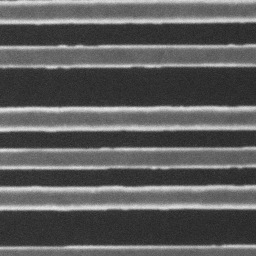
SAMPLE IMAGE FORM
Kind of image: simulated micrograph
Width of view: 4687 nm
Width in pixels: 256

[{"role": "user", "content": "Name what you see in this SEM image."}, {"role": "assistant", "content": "lines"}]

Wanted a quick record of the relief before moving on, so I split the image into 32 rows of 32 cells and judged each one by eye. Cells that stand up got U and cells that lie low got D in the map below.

UUUUUUUUUUUUUUUUUUUUUUUUUUUUUUUU
UUUUUUUUUUUUUUUUUUUUUUUUUUUUUUUU
UUUUUUUUUUUUUUUUUUUUUUUUUUUUUUUU
DDDDDDDDDDDDDDDDDDDDDDDDDDDDDDDD
DDDDDDDDDDDDDDDDDDDDDDDDDDDDDDDD
DDDDDDDDDDDDDDDDDDDDDDDDDDDDDDDD
UUUUUUUUUUUUUUUUUUUUUUUUUUUUUUUU
UUUUUUUUUUUUUUUUUUUUUUUUUUUUUUUU
DDDDDDDDDDDDDDDDDDDDDDDDDDDDDDDD
DDDDDDDDDDDDDDDDDDDDDDDDDDDDDDDD
DDDDDDDDDDDDDDDDDDDDDDDDDDDDDDDD
DDDDDDDDDDDDDDDDDDDDDDDDDDDDDDDD
DDDDDDDDDDDDDDDDDDDDDDDDDDDDDDDD
DDDDDDDDDDDDDDDDDDDDUUDDUUUUDDUU
UUUUUUUUUUUUUUUUUUUUUUUUUUUUUUUU
UUUUUUUUUUUUUUUUUUUUUUUUUUUUUUUU
DDDDDDDDDDDDDDDDDDDDDDDDDDDDDDDD
DDDDDDDDDDDDDDDDDDDDDDDDDDDDDDDD
DDDDDDDDDDDDDDDDDDDDDDDDDDDDDDDU
UUUUUUUUUUUUUUUUUUUUUUUUUUUUUUUU
UUUUUUUUUUUUUUUUUUUUUUUUUUUUUUUU
DDDDDDDDDDDDDDDDDDDDDDDDDDDDDDDD
DDDDDDDDDDDDDDDDDDDDDDDDDDDDDDDD
DDDDDDDDDDDDDUUUDDUUUUUUUUUUUUUU
UUUUUUUUUUUUUUUUUUUUUUUUUUUUUUUU
UUUUUUUUUUUUUUUUUUUUUUUUUUUUUUUU
DDDDDDDDDDDDDDDDDDDDDDDDDDDDDDDD
DDDDDDDDDDDDDDDDDDDDDDDDDDDDDDDD
DDDDDDDDDDDDDDDDDDDDDDDDDDDDDDDD
DDDDDDDDDDDDDDDDDDDDDDDDDDDDDDDD
DDDDDDDDDDDDDDDDDDDDDDDDDDDDDDDD
UUUUUUUUUUUUUUUUUUUUUUUUUUUUUUUU